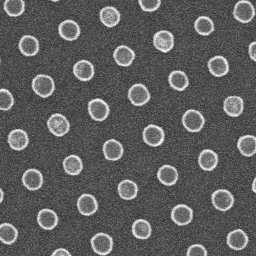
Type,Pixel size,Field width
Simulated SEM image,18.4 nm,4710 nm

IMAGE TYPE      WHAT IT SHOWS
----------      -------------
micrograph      a regular array of raised bodies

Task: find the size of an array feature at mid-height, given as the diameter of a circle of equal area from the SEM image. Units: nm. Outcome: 361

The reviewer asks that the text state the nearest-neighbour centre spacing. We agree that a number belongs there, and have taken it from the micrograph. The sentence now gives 0.777 microns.